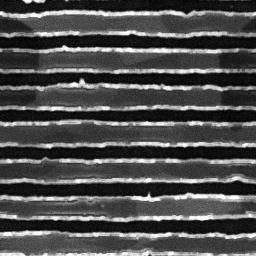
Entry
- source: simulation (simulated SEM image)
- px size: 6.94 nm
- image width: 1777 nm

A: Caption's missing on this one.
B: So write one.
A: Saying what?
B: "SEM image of parallel lines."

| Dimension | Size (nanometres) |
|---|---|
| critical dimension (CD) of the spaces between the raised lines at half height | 93.7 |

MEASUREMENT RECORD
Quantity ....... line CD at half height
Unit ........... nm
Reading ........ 163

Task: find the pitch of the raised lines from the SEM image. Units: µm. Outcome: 0.255